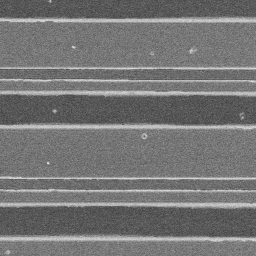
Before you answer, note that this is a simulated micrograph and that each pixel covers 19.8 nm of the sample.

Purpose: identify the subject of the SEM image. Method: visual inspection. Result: lines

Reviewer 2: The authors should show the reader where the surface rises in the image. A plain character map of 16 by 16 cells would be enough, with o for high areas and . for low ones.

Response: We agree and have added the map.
................
oooooooooooooooo
oooooooooooooooo
oooooooooooooooo
oooooooooooooooo
oooooooooooooooo
................
................
oooooooooooooooo
oooooooooooooooo
oooooooooooooooo
oooooooooooooooo
oooooooooooooooo
................
................
oooooooooooooooo